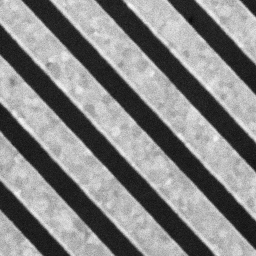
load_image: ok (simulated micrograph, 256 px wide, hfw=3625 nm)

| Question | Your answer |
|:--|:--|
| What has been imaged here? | lines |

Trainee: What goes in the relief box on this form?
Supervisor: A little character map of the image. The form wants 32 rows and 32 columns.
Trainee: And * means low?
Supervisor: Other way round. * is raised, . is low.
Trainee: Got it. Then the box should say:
***....*****....*****....*****..
****....*****....*****....*****.
*****....*****....*****....*****
.*****....*****....*****....****
.******...******....*****....***
..******...******....*****....**
...******...******...******...**
*...******...******...******...*
**...******...******...******...
**....******...******...******..
***....*****....******...******.
****....*****....*****....******
*****....*****....*****....*****
.*****....*****....*****....****
..*****....*****....*****....***
...*****....*****....*****....**
....*****....*****....*****....*
*....*****....*****....*****....
**...******...******....*****...
***...******...******...******..
****...******...******...******.
*****...******...******...******
******...******...******...*****
.******...******...******...****
..*****....*****....******...***
...*****....*****....******...**
....*****....*****....*****....*
*....*****....*****....*****....
**....*****....*****....*****...
***....*****....*****....*****..
****....*****....*****....*****.
*****...******....*****....*****